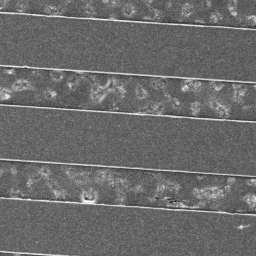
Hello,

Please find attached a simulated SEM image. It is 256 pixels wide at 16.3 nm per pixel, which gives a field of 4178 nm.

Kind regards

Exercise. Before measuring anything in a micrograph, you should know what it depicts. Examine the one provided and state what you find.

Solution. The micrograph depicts one or a few lines or trenches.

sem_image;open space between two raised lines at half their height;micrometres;0.633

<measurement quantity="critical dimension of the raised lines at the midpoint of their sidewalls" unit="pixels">54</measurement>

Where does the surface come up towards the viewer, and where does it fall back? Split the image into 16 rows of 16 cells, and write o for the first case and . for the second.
................
ooooooooooo.....
oooooooooooooooo
oooooooooooooooo
......oooooooooo
................
................
oooooooooooooo..
oooooooooooooooo
oooooooooooooooo
........oooooooo
................
oo..............
oooooooooooooooo
oooooooooooooooo
oooooooooooooooo